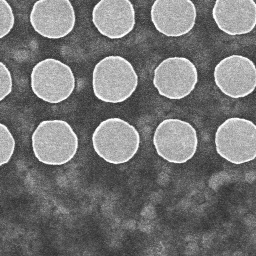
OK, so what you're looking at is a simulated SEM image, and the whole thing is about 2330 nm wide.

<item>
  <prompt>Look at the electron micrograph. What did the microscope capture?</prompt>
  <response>raised bodies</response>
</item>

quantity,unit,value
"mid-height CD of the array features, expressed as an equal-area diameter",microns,0.398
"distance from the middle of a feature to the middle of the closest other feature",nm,558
